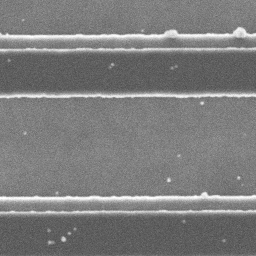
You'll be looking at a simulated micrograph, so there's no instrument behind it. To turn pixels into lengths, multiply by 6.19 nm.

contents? lines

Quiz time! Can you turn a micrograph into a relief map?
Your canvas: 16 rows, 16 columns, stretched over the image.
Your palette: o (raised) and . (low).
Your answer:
................
................
oooooooooooooooo
oooooooooooooooo
oooooooooooooooo
oooooooooooooooo
................
................
................
................
................
................
oooooooooooooooo
oooooooooooooooo
oooooooooooooooo
oooooooooooooooo